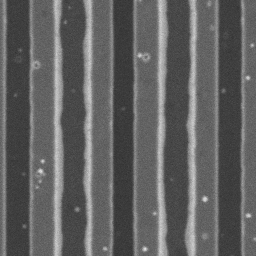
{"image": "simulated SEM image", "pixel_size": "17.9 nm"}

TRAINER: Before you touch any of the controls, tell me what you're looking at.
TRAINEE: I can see lines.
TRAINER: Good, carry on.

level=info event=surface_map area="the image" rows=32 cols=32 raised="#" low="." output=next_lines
#...###....###...###....###...##
#...###....###...###....###...##
#...###....###...###....###...##
#...###....###...###....###...##
#...###....###...###....###...##
#...###....###...###....###...##
#...###....###...###....###...##
#...###....###...###....###...##
#...###....###...###....###...##
#...###....###...###....###...##
#...###....###...###....###...##
#...###....###...###....###...##
#...###....###...###....###...##
#...###....###...###....###...##
#...###....###...###....###...##
#...###....###...###....###...##
#...###....###...###....###...##
#...###....###...###....###...##
#...###....###...###....###...##
#...###....###...###....###...##
#...###....###...###....###...##
#...###....###...###....###...##
#...###....###...###....###...##
#...###....###...###....###...##
#...###....###...###....###...##
#...###....###...###....###...##
#...###....###...###....###...##
#...###....###...###....###...##
#...###....###...###....###...##
#...###....###...###....###...##
#...###....###...###....###...##
#...###....###...###....###...##